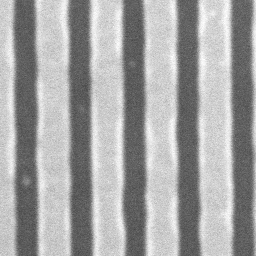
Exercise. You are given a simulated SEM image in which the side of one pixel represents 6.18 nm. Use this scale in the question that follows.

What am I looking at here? wiring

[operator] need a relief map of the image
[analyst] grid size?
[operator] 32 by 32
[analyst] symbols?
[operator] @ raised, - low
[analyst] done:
@@---@@@----@@@---@@@@---@@@----
@@---@@@----@@@---@@@@---@@@----
@@---@@@----@@@---@@@@---@@@----
@@---@@@----@@@---@@@@---@@@----
@----@@@----@@@---@@@@---@@@----
@----@@@----@@@---@@@@---@@@----
@----@@@----@@@---@@@@---@@@----
@@---@@@----@@@---@@@@---@@@----
@@---@@@---@@@@---@@@@---@@@@---
@@---@@@---@@@@---@@@@---@@@@---
@@---@@@----@@@---@@@@---@@@@---
@----@@@----@@@---@@@@---@@@@---
@----@@@----@@@---@@@@---@@@----
@----@@@@---@@@---@@@@---@@@@---
@----@@@@---@@@---@@@@---@@@@---
@@---@@@@---@@@---@@@@---@@@@---
@@---@@@@---@@@----@@@---@@@@---
@@---@@@@---@@@----@@@---@@@----
@----@@@@---@@@----@@@---@@@@---
@----@@@@---@@@----@@@---@@@@---
@@---@@@@---@@@----@@@---@@@@---
@@---@@@@---@@@----@@@---@@@@---
@@---@@@@---@@@----@@@---@@@@---
@@---@@@@---@@@---@@@@---@@@@---
@@---@@@@---@@@---@@@@---@@@@---
@@---@@@@---@@@----@@@---@@@@---
@@---@@@----@@@----@@@---@@@@---
@@---@@@----@@@----@@@---@@@@---
@@---@@@@---@@@----@@@---@@@@---
@@---@@@@---@@@----@@@---@@@@---
@@---@@@@---@@@----@@@---@@@@---
@@---@@@@---@@@----@@@---@@@@---